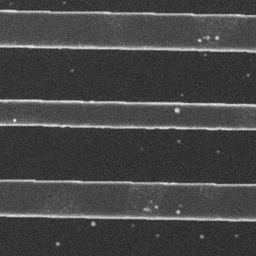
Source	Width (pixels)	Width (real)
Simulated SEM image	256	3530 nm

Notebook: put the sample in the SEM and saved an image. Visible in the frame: lines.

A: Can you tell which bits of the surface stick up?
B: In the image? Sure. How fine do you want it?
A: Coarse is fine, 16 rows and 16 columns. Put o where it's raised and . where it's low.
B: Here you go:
................
oooooooooooooooo
oooooooooooooooo
................
................
................
oooooooooooooo..
oooooooooooooooo
................
................
................
ooooooooooo.....
oooooooooooooooo
..oooooooooooooo
................
................